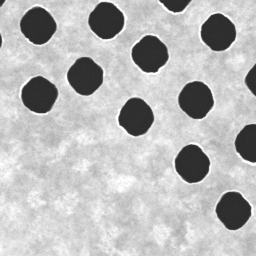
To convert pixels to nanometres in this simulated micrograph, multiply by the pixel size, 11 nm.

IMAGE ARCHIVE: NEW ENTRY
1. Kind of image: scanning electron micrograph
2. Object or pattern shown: a regular array of holes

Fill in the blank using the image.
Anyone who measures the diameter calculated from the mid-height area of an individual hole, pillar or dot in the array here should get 394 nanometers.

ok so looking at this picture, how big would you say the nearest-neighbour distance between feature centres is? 684 nanometers